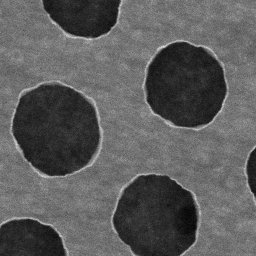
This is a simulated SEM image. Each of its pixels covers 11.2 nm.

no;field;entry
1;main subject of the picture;holes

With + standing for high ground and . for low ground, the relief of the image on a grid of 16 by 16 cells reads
+++....+++++++++
++++...+++++++++
++++++++++++++++
++++++++++...+++
+++++++++.....++
++..+++++.....++
+.....+++.....++
+.....++++...+++
+.....++++++++++
+.....++++++++++
++...++++++++++.
++++++++...+++++
+++++++.....++++
+++++++.....++++
....+++.....++++
....++++....++++